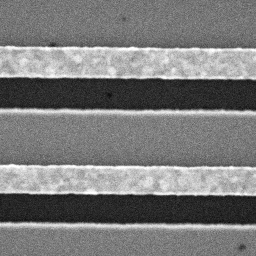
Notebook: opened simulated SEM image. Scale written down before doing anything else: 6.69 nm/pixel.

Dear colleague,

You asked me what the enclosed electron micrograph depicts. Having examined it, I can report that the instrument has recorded lines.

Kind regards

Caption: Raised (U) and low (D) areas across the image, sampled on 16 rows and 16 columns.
UUUUUUUUUUUUUUUU
UUUUUUUUUUUUUUUU
UUUUUUUUUUUUUUUU
UUUUUUUUUUUUUUUU
UUUUUUUUUUUUUUUU
DDDDDDDDDDDDDDDD
DDDDDDDDDDDDDDDD
UUUUUUUUUUUUUUUU
UUUUUUUUUUUUUUUU
UUUUUUUUUUUUUUUU
UUUUUUUUUUUUUUUU
UUUUUUUUUUUUUUUU
DDDDDDDDDDDDDDDD
DDDDDDDDDDDDDDDD
UUUUUUUUUUUUUUUU
UUUUUUUUUUUUUUUU